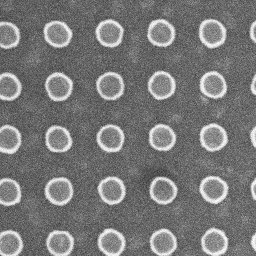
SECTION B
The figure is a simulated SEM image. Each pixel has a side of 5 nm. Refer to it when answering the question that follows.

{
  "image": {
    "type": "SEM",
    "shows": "a regular array of raised bodies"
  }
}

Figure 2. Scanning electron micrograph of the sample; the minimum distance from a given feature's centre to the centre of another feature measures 257 nanometers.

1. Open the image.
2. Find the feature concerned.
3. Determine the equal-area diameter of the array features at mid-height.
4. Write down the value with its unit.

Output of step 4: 128 nanometers